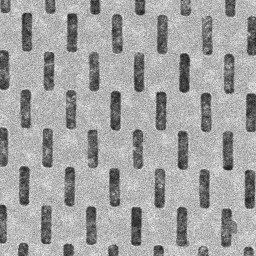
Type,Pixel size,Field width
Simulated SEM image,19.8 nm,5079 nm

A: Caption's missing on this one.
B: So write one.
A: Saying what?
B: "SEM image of a regular array of holes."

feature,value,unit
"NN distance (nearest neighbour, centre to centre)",865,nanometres